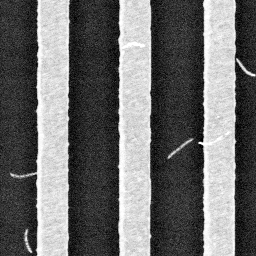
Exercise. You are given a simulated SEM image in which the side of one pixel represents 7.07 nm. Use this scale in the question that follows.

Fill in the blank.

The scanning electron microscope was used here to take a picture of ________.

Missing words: lines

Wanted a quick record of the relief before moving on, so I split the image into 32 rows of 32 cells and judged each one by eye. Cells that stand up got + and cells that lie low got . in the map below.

.....++++......++++.......+++...
.....++++......++++.......+++...
.....++++......++++.......+++...
.....++++......++++.......+++...
.....++++......++++.......+++...
.....++++......++++.......+++...
.....++++......++++.......+++...
.....++++......++++.......+++...
.....++++......++++.......+++...
.....++++......++++.......+++...
.....++++......++++.......+++...
.....++++......++++.......+++...
.....++++......++++.......+++...
.....++++......++++.......+++...
.....++++......++++.......+++...
.....+++.......++++.......+++...
.....+++.......++++.......+++...
.....++++......++++......++++...
.....++++......++++......++++...
.....++++......++++.......+++...
.....+++.......++++.......+++...
.....++++......++++.......+++...
.....+++.......++++.......+++...
.....++++......++++.......+++...
.....+++.......++++.......+++...
.....+++.......++++.......+++...
.....+++.......++++.......+++...
.....+++.......++++.......+++...
.....+++.......++++.......+++...
.....++++......++++.......+++...
.....+++.......++++.......+++...
.....+++.......++++.......+++...